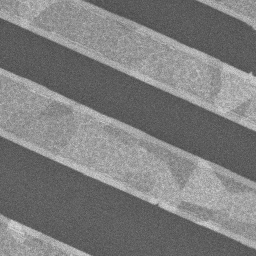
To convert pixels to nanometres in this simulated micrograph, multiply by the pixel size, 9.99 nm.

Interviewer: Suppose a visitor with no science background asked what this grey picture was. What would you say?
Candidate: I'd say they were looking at one or a few lines or trenches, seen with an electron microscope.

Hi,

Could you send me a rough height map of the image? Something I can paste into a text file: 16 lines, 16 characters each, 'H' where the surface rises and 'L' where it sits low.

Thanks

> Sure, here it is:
HHHHHHLLLLLLLLHH
LHHHHHHHLLLLLLLL
LLLLHHHHHHLLLLLL
LLLLLLHHHHHHHLLL
LLLLLLLLHHHHHHHL
HHLLLLLLLLHHHHHH
HHHHHLLLLLLLLHHH
HHHHHHHLLLLLLLLH
LHHHHHHHHLLLLLLL
LLLHHHHHHHHLLLLL
LLLLLHHHHHHHHHLL
LLLLLLLHHHHHHHHH
LLLLLLLLLHHHHHHH
LLLLLLLLLLLLHHHH
HHLLLLLLLLLLLLHH
HHHHLLLLLLLLLLLL